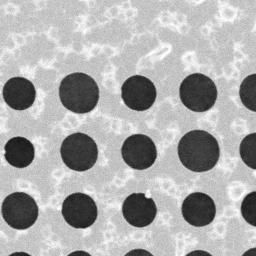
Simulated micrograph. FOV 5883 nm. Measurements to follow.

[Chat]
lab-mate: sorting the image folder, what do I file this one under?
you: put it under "a regular array of holes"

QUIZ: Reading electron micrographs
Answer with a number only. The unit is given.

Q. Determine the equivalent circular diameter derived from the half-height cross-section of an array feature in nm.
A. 835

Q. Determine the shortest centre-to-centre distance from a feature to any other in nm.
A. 1340